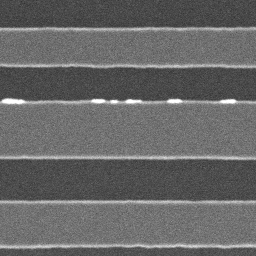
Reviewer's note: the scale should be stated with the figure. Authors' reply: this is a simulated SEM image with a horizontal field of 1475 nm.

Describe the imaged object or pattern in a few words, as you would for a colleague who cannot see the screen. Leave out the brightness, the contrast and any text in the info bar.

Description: lines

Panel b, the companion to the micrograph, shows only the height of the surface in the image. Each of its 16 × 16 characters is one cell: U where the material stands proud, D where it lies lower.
DDDDDDDDDDDDDDDD
DDDDDDDDDDDDDDDD
UUUUUUUUUUUUUUUU
UUUUUUUUUUUUUUUU
DDDDDDDDDDDDDDDD
DDDDDDDDDDDDDDDD
UUUUUUUUUUUUUUUU
UUUUUUUUUUUUUUUU
UUUUUUUUUUUUUUUU
UUUUUUUUUUUUUUUU
DDDDDDDDDDDDDDDD
DDDDDDDDDDDDDDDD
DDDDDDDDDDDDDDDD
UUUUUUUUUUUUUUUU
UUUUUUUUUUUUUUUU
DDDDDDDDDDDDDDDD